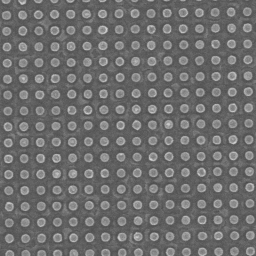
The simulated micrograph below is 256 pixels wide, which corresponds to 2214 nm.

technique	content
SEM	a regular array of raised bodies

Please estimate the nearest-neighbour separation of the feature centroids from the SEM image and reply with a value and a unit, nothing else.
136 nm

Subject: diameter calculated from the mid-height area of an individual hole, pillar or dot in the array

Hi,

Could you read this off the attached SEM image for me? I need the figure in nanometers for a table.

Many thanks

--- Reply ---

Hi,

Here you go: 73.1